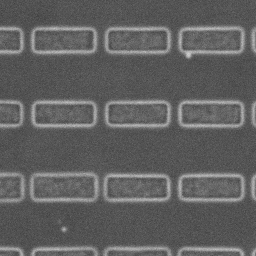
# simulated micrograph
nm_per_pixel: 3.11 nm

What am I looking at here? an array of small figures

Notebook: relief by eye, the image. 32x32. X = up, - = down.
XXXXXXXXXXXXXXXXXXXXXXXXXXXXXXXX
XXXXXXXXXXXXXXXXXXXXXXXXXXXXXXXX
XXXXXXXXXXXXXXXXXXXXXXXXXXXXXXXX
XXXXXXXXXXXXXXXXXXXXXXXXXXXXXXXX
---X--------X--------XX-------XX
---X--------X--------XX-------XX
XXXXXXXXXXXXXXXXXXXXXXXXXXXXXXXX
XXXXXXXXXXXXXXXXXXXXXXXXXXXXXXXX
XXXXXXXXXXXXXXXXXXXXXXXXXXXXXXXX
XXXXXXXXXXXXXXXXXXXXXXXXXXXXXXXX
XXXXXXXXXXXXXXXXXXXXXXXXXXXXXXXX
XXXXXXXXXXXXXXXXXXXXXXXXXXXXXXXX
XXXXXXXXXXXXXXXXXXXXXXXXXXXXXXXX
---X--------XX-------XX-------XX
---X--------X--------XX-------XX
--XXX------XXX-------XX-------XX
XXXXXXXXXXXXXXXXXXXXXXXXXXXXXXXX
XXXXXXXXXXXXXXXXXXXXXXXXXXXXXXXX
XXXXXXXXXXXXXXXXXXXXXXXXXXXXXXXX
XXXXXXXXXXXXXXXXXXXXXXXXXXXXXXXX
XXXXXXXXXXXXXXXXXXXXXXXXXXXXXXXX
XXXXXXXXXXXXXXXXXXXXXXXXXXXXXXXX
---X--------X--------XX-------XX
---X--------X--------XX-------XX
---X--------X--------XX-------XX
XXXXXXXXXXXXXXXXXXXXXXXXXXXXXXXX
XXXXXXXXXXXXXXXXXXXXXXXXXXXXXXXX
XXXXXXXXXXXXXXXXXXXXXXXXXXXXXXXX
XXXXXXXXXXXXXXXXXXXXXXXXXXXXXXXX
XXXXXXXXXXXXXXXXXXXXXXXXXXXXXXXX
XXXXXXXXXXXXXXXXXXXXXXXXXXXXXXXX
--XX--------X--------XX-------XX